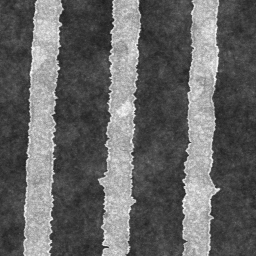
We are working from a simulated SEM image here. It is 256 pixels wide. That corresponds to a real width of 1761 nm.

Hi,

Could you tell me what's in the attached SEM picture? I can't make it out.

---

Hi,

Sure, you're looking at one or a few lines or trenches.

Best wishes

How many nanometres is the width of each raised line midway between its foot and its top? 175